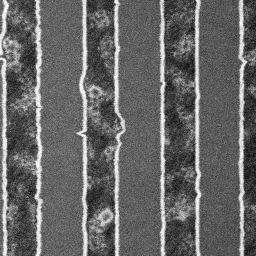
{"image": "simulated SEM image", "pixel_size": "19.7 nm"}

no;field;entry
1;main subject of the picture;one or a few lines or trenches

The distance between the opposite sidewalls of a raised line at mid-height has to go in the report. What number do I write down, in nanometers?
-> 681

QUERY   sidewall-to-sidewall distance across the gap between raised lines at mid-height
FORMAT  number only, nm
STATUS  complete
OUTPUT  890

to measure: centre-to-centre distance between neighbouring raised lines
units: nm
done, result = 1560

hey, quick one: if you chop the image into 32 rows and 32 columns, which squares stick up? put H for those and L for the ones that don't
LHHHHLLLLLLHHHHLLLLLHHHHHLLLLLHH
LHHHHLLLLLLHHHLLLLLLHHHHHLLLLLHH
LHHHHLLLLLLHHHLLLLLLHHHHHLLLLLHH
HHHHHLLLLLLHHHHLLLLLHHHHHLLLLLHH
HHHHHLLLLLLHHHHLLLLLHHHHHLLLLLHH
HHHHHLLLLLLHHHHLLLLLHHHHHLLLLLHH
HHHHHLLLLLLHHHHLLLLLHHHHHLLLLLHH
HHHHHLLLLLLHHHHLLLLLHHHHHLLLLLHH
HHHHHLLLLLLHHHHLLLLLHHHHHLLLLLHH
HHHHHLLLLLHHHHHLLLLLHHHHHLLLLLHH
LHHHHLLLLLHHHHHLLLLLHHHHHLLLLLHH
LHHHHLLLLLHHHHHLLLLLHHHHHLLLLLHH
LHHHHLLLLLLHHHHLLLLLHHHHHLLLLLHH
LHHHHLLLLLLHHHHLLLLLHHHHHLLLLLHH
LHHHHLLLLLLHHHHLLLLLHHHHHLLLLLHH
LHHHHLLLLLLHHHHLLLLLHHHHHLLLLLHH
LHHHHLLLLLHHHHHLLLLLHHHHHLLLLLHH
LHHHHLLLLLLHHHHLLLLLHHHHHLLLLLHH
LHHHHLLLLLLHHHHLLLLLHHHHHLLLLLHH
LHHHHLLLLLLHHHHLLLLLHHHHHLLLLLHH
LHHHHLLLLLLHHHHLLLLLHHHHHLLLLLHH
LHHHHLLLLLLHHHHLLLLLHHHHHLLLLLHH
LHHHHLLLLLLHHHHLLLLLHHHHHLLLLLHH
LHHHHLLLLLLHHHHLLLLLHHHHHLLLLLHH
LHHHHLLLLLHHHHHLLLLLHHHHHLLLLLHH
LHHHHLLLLLLHHHHLLLLLHHHHHLLLLLHH
LHHHHLLLLLLHHHHLLLLLHHHHHLLLLLHH
LHHHHLLLLLLHHHHLLLLLHHHHHLLLLLHH
LHHHHLLLLLHHHHHLLLLLHHHHHLLLLLHH
LHHHHLLLLLLHHHHLLLLLHHHHHLLLLLHH
LHHHHLLLLLLHHHHLLLLLHHHHHLLLLLHH
LHHHHLLLLLLHHHHLLLLLHHHHHLLLLLHH